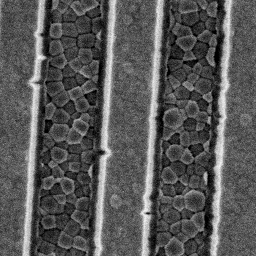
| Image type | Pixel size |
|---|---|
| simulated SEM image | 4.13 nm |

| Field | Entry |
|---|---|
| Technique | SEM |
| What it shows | one or a few lines or trenches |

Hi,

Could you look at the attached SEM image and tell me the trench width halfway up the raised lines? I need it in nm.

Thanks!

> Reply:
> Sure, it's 288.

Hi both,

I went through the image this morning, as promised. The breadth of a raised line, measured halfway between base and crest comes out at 47.9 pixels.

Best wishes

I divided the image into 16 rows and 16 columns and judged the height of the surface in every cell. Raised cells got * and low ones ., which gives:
***....***....**
***....***....**
**.....***....**
**.....***....**
**.....***....**
**.....***....**
**.....***....**
**.....***....**
**....****....**
**.....**.....**
**....***.....**
**....***.....**
**....***.....**
**....***.....**
**....***....***
**....***....***